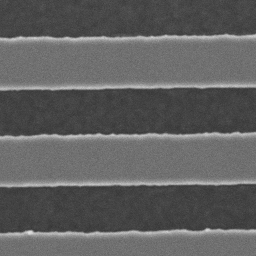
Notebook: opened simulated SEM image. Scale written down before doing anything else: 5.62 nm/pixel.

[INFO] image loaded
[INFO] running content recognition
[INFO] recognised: lines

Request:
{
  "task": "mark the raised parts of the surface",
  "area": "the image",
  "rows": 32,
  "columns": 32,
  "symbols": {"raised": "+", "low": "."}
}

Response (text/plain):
................................
................................
................................
................................
....................++.++.++++++
++++++++++++++++++++++++++++++++
++++++++++++++++++++++++++++++++
++++++++++++++++++++++++++++++++
++++++++++++++++++++++++++++++++
++++++++++++++++++++++++++++++++
++++++++++++++++++++++++++++++++
................................
................................
................................
................................
................................
................................
++++++++++++++++++++++++++++++++
++++++++++++++++++++++++++++++++
++++++++++++++++++++++++++++++++
++++++++++++++++++++++++++++++++
++++++++++++++++++++++++++++++++
++++++++++++++++++++++++++++++++
................................
................................
................................
................................
................................
................................
++++++++++++++++++++++++++++++++
++++++++++++++++++++++++++++++++
++++++++++++++++++++++++++++++++